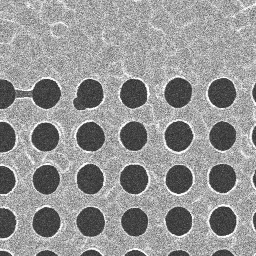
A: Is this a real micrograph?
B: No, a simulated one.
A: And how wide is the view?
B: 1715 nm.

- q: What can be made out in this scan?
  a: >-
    a regular array of holes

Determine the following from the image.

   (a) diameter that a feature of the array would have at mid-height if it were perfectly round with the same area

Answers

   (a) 192 nm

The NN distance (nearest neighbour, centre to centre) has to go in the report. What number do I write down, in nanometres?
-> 285